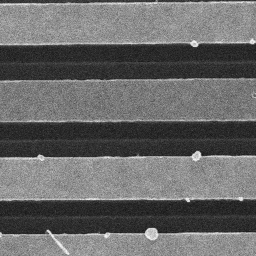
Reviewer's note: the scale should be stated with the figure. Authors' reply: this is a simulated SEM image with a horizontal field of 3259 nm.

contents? lines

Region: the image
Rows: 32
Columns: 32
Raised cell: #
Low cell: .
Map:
################################
################################
################################
################################
################################
#########...............#.......
................................
................................
................................
................................
################################
################################
################################
################################
################################
................................
................................
................................
................................
........................##......
################################
################################
################################
################################
################################
................................
................................
................................
................................
################################
################################
################################